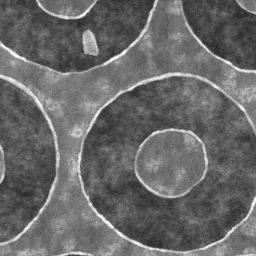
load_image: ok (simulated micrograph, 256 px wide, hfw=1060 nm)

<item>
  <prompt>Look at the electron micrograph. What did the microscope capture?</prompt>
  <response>ring-shaped grooves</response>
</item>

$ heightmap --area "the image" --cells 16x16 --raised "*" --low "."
...***....*....*
.........***....
........****....
*......*******..
****.***********
.*******......**
..*****........*
...***..........
...**....***....
...**....****...
....*...*****...
...**....***....
...***..........
..****.........*
.******.......**
**********...***